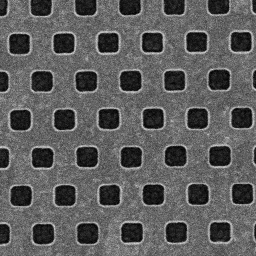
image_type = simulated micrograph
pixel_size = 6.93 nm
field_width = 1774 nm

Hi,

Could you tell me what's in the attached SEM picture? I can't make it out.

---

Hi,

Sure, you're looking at a regular array of holes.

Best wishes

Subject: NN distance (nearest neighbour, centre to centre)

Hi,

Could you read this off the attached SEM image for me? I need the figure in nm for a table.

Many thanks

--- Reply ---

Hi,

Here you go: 302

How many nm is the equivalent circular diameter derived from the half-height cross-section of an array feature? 161